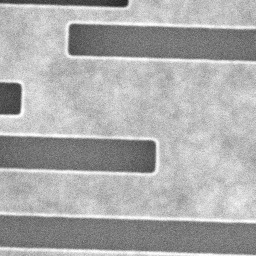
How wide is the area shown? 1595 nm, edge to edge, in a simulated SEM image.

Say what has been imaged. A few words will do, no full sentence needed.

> groups of lines, slits or small figures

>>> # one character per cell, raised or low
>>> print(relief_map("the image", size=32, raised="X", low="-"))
----------------XXXXXXXXXXXXXXXX
XXXXXXXXXXXXXXXXXXXXXXXXXXXXXXXX
XXXXXXXXXXXXXXXXXXXXXXXXXXXXXXXX
XXXXXXXXX---------------------XX
XXXXXXXX------------------------
XXXXXXXX------------------------
XXXXXXXXX-----------------------
XXXXXXXXXXXXXXXXXXXXXXX---------
XXXXXXXXXXXXXXXXXXXXXXXXXXXXXXXX
XXXXXXXXXXXXXXXXXXXXXXXXXXXXXXXX
---XXXXXXXXXXXXXXXXXXXXXXXXXXXXX
---XXXXXXXXXXXXXXXXXXXXXXXXXXXXX
---XXXXXXXXXXXXXXXXXXXXXXXXXXXXX
---XXXXXXXXXXXXXXXXXXXXXXXXXXXXX
XXXXXXXXXXXXXXXXXXXXXXXXXXXXXXXX
XXXXXXXXXXXXXXXXXXXXXXXXXXXXXXXX
XXXXXXXXXXXXXXXXXXXXXXXXXXXXXXXX
-------------------XXXXXXXXXXXXX
--------------------XXXXXXXXXXXX
--------------------XXXXXXXXXXXX
--------------------XXXXXXXXXXXX
XXXXXXXXXXXX-------XXXXXXXXXXXXX
XXXXXXXXXXXXXXXXXXXXXXXXXXXXXXXX
XXXXXXXXXXXXXXXXXXXXXXXXXXXXXXXX
XXXXXXXXXXXXXXXXXXXXXXXXXXXXXXXX
XXXXXXXXXXXXXXXXXXXXXXXXXXXXXXXX
XXXXXXXXXXXXXXXXXXXXXXXXXXXXXXXX
-------------------------XXXXXXX
--------------------------------
--------------------------------
--------------------------------
XXXXXXXXXXXXXXXXX---------------